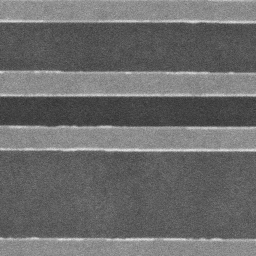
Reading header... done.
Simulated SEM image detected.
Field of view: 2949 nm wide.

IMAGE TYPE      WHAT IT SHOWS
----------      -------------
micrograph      lines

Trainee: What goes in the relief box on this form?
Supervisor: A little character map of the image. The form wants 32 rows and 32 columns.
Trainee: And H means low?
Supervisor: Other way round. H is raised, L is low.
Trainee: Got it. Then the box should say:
HHHHHHHHHHHHHHHHHHHHHHHHHHHHHHHH
HHHHHHHHHHHHHHHHHHHHHHHHHHHHHHHH
HHHHHHHHHHHHHHHHHHHHHHHHHHHHHHHH
LLLLLLLLLLLLLLLLLLLLLLLLLLLLLLLL
LLLLLLLLLLLLLLLLLLLLLLLLLLLLLLLL
LLLLLLLLLLLLLLLLLLLLLLLLLLLLLLLL
LLLLLLLLLLLLLLLLLLLLLLLLLLLLLLLL
LLLLLLLLLLLLLLLLLLLLLLLLLLLLLLLL
LLLLLLLLLLLLLLLLLLLLLLLLLLLLLLLL
HHHHHHHHHHHHHHHHHHHHHHHHHHHHHHHH
HHHHHHHHHHHHHHHHHHHHHHHHHHHHHHHH
HHHHHHHHHHHHHHHHHHHHHHHHHHHHHHHH
LLLLLLLLLLLLLLLLLLLLLLLLLLLLLLLL
LLLLLLLLLLLLLLLLLLLLLLLLLLLLLLLL
LLLLLLLLLLLLLLLLLLLLLLLLLLLLLLLL
LLLLLLLLLLLLLLLLLLLLLLLLLLLLLLLL
HHHHHHHHHHHHHHHHHHHHHHHHHHHHHHHH
HHHHHHHHHHHHHHHHHHHHHHHHHHHHHHHH
HHHHHHHHHHHHHHHHHHHHHHHHHHHHHHHH
LLLLLLLLLLLLLLLLLLLLLLLLLLLLLLLL
LLLLLLLLLLLLLLLLLLLLLLLLLLLLLLLL
LLLLLLLLLLLLLLLLLLLLLLLLLLLLLLLL
LLLLLLLLLLLLLLLLLLLLLLLLLLLLLLLL
LLLLLLLLLLLLLLLLLLLLLLLLLLLLLLLL
LLLLLLLLLLLLLLLLLLLLLLLLLLLLLLLL
LLLLLLLLLLLLLLLLLLLLLLLLLLLLLLLL
LLLLLLLLLLLLLLLLLLLLLLLLLLLLLLLL
LLLLLLLLLLLLLLLLLLLLLLLLLLLLLLLL
LLLLLLLLLLLLLLLLLLLLLLLLLLLLLLLL
LLLLLLLLLLLLLLLLLLLLLLLLLLLLLLLL
HHHHHHHHHHHHHHHHHHHHHHHHHHHHHHHH
HHHHHHHHHHHHHHHHHHHHHHHHHHHHHHHH